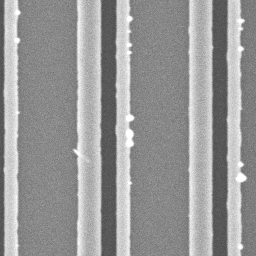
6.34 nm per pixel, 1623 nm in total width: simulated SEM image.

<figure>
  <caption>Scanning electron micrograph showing lines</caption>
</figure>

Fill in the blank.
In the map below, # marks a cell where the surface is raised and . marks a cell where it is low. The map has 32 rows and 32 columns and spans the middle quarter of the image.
....#####....###................
....#####....###................
....#####....###................
....#####....###................
....#####....###................
....#####....###................
....#####....###................
....#####....###................
....#####....###................
....#####....###................
....#####....###................
....#####....###................
....#####....###................
....#####....####...............
....#####....###................
....#####....###................
....#####....####...............
....#####....####...............
....#####....####...............
....#####....####...............
....#####....####...............
...######....###................
...######....###................
....#####....###................
....#####....###................
....#####....###................
....#####....###................
....#####....###................
....#####....####...............
....#####....####...............
....#####....###................
....#####....###................